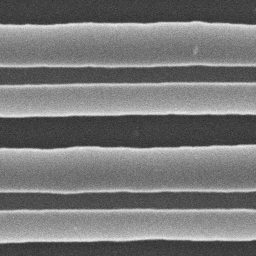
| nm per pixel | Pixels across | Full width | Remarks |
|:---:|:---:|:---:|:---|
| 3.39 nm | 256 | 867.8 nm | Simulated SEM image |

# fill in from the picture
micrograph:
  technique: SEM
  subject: lines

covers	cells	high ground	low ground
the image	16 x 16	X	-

----------------
----XXXXXXXXXXX-
XXXXXXXXXXXXXXXX
XXXXXXXXXXXXXXXX
XXXXXXXXXXXXXXXX
XXXXXXXXXXXXXXXX
XXXXXXXXXXXXXXXX
----------------
----------------
XXXXXXXXXXXXXXXX
XXXXXXXXXXXXXXXX
XXXXXXXXXXXXXXXX
XXXXXXXXXXXXXXXX
XXXXXXXXXXXXXXXX
XXXXXXXXXXXXXXXX
----------------